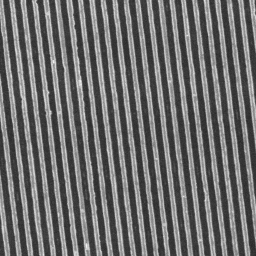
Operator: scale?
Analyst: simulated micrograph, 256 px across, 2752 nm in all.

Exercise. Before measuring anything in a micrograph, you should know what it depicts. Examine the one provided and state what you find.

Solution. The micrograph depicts parallel lines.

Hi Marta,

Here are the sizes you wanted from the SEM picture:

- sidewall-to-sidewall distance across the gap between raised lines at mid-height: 0.0708 um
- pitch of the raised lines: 122 nanometres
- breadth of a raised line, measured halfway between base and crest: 4.6 pixels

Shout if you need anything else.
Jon